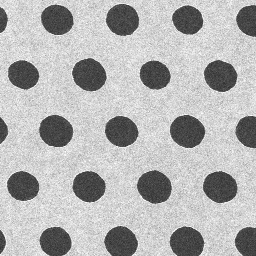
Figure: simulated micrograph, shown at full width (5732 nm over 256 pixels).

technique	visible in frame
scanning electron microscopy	a regular array of holes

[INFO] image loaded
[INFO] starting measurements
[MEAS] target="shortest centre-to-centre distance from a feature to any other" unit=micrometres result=1.44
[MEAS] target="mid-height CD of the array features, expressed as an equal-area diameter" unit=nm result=722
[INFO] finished